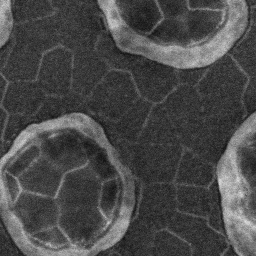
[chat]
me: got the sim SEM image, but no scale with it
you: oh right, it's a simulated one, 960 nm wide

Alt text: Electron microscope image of raised bodies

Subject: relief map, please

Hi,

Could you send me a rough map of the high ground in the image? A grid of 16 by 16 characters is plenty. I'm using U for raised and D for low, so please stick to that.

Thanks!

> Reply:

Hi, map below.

DDDDDDDUUUUUUUDD
DDDDDDDUUUUUUUDD
DDDDDDDUUUUUUUDD
DDDDDDDDDDDUDDDD
DDDDDDDDDDDDDDDD
DDDDDDDDDDDDDDDD
DDDDDDDDDDDDDDDD
DDDDUDDDDDDDDDDD
DDUUUUDDDDDDDDDU
DUUUUUUDDDDDDDUU
UUUUUUUDDDDDDDUU
UUUUUUUUDDDDDDUU
UUUUUUUUDDDDDDUU
DUUUUUUUDDDDDDDU
DUUUUUUDDDDDDDDU
DDUUUUDDDDDDDDDD